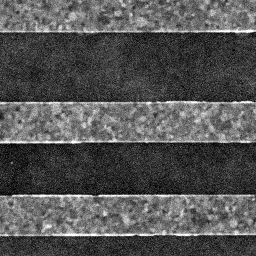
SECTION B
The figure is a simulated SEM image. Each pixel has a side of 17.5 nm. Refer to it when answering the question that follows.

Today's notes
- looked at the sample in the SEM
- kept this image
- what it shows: lines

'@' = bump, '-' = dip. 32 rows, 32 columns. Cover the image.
@@@@@@@@@@@@@@@@@@@@@@@@@@@@@@@@
@@@@@@@@@@@@@@@@@@@@@@@@@@@@@@@@
@@@@@@@@@@@@@@@@@@@@@@@@@@@@@@@@
@@@@@@@@@@@@@@@@@@@@@@@@@@@@@@@@
--------------------------------
--------------------------------
--------------------------------
--------------------------------
--------------------------------
--------------------------------
--------------------------------
--------------------------------
--------------------------------
@@@@@@@@@@@@@@@@@@@@@@@@@@@@@@@@
@@@@@@@@@@@@@@@@@@@@@@@@@@@@@@@@
@@@@@@@@@@@@@@@@@@@@@@@@@@@@@@@@
@@@@@@@@@@@@@@@@@@@@@@@@@@@@@@@@
@@@@@@@@@@@@@@@@@@@@@@@@@@@@@@@@
--------------------------------
--------------------------------
--------------------------------
--------------------------------
--------------------------------
--------------------------------
-@@@@@@@@@@@@@@@@@@@@@@@@@@@@@@@
@@@@@@@@@@@@@@@@@@@@@@@@@@@@@@@@
@@@@@@@@@@@@@@@@@@@@@@@@@@@@@@@@
@@@@@@@@@@@@@@@@@@@@@@@@@@@@@@@@
@@@@@@@@@@@@@@@@@@@@@@@@@@@@@@@@
--------------------------------
--------------------------------
--------------------------------